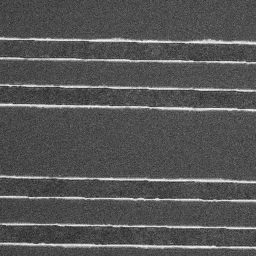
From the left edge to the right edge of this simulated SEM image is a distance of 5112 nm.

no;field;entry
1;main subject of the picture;lines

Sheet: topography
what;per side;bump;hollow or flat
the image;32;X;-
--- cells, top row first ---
XXXXXXXXXXXXXXXXXXXXXXXXXXXXXXXX
XXXXXXXXXXXXXXXXXXXXXXXXXXXXXXXX
XXXXXXXXXXXXXXXXXXXXXXXXXXXXXXXX
XXXXXXXXXXXXXXXXXXXXXXXXXXXXXXXX
XXXXXXXXXXXXXXXXXXXXXXXXXXXXXXXX
--------------------------------
--------------------------------
XXXXXXXXXX----------------------
XXXXXXXXXXXXXXXXXXXXXXXXXXXXXXXX
XXXXXXXXXXXXXXXXXXXXXXXXXXXXXXXX
XXXXXXXXXXXXXXXXXXXXXXXXXXXXXXXX
--------------------------------
--------------------------------
XXXXXXXXXXXXXXXXXXXXX-----------
XXXXXXXXXXXXXXXXXXXXXXXXXXXXXXXX
XXXXXXXXXXXXXXXXXXXXXXXXXXXXXXXX
XXXXXXXXXXXXXXXXXXXXXXXXXXXXXXXX
XXXXXXXXXXXXXXXXXXXXXXXXXXXXXXXX
XXXXXXXXXXXXXXXXXXXXXXXXXXXXXXXX
XXXXXXXXXXXXXXXXXXXXXXXXXXXXXXXX
XXXXXXXXXXXXXXXXXXXXXXXXXXXXXXXX
XXXXXXXXXXXXXXXXXXXXXXXXXXXXXXXX
--------------------XXXXXXXXXXXX
--------------------------------
--------------------------------
XXXXXXXXXXXXXXXXXXXXXXXXXXXXXXXX
XXXXXXXXXXXXXXXXXXXXXXXXXXXXXXXX
XXXXXXXXXXXXXXXXXXXXXXXXXXXXXXXX
----------------------------XXXX
--------------------------------
XX------------------------------
XXXXXXXXXXXXXXXXXXXXXXXXXXXXXXXX